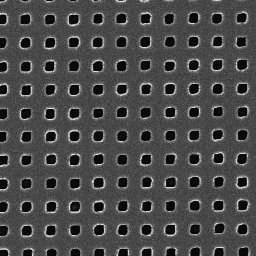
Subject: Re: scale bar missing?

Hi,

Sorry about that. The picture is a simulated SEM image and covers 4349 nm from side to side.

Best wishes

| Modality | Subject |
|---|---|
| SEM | a regular array of holes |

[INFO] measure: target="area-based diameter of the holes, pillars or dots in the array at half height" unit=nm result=181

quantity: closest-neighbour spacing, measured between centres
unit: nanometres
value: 393